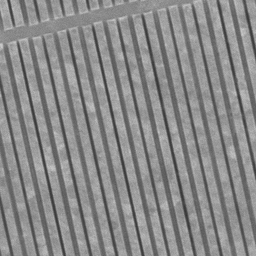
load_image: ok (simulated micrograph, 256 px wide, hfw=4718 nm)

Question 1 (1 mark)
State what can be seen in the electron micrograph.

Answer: parallel lines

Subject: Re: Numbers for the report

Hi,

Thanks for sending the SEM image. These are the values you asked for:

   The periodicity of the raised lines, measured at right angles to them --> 235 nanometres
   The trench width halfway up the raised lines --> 67.5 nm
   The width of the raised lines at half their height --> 0.149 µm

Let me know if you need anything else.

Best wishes